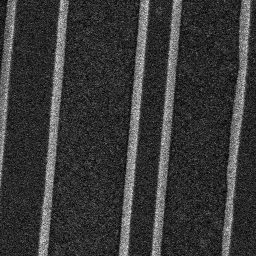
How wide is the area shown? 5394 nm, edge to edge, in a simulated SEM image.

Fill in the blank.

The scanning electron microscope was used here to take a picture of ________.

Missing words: one or a few lines or trenches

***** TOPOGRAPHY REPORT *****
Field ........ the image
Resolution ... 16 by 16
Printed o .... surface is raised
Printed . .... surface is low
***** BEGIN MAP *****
.ooo.....oo....o
.ooo.....oo....o
.ooo.....oo....o
oooo.....oo....o
oooo.....oo....o
oooo.....oo....o
ooo......oo....o
ooo.....oo.....o
ooo.....oo.....o
ooo.....oo.....o
ooo.....oo.....o
ooo.....oo....oo
ooo.....oo....oo
ooo.....oo....oo
ooo.....oo....oo
ooo.....oo....oo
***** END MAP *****